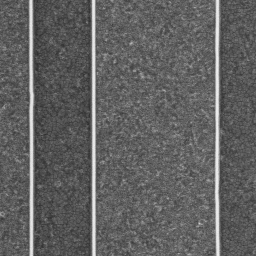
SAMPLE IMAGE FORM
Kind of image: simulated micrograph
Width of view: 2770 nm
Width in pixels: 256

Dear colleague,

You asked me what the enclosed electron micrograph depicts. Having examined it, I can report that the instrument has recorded one or a few lines or trenches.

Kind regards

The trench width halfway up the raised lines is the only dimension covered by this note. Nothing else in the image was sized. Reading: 676 nm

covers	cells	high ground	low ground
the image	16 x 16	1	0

1100001111111100
1100001111111100
1100001111111100
1100001111111100
1100001111111100
1100001111111100
1100001111111100
1100001111111100
1100001111111100
1100001111111100
1100001111111100
1100001111111100
1100001111111100
1100001111111100
1100001111111100
1100001111111100